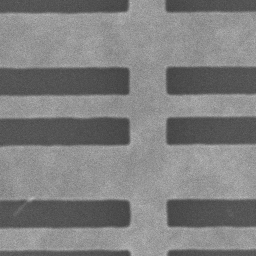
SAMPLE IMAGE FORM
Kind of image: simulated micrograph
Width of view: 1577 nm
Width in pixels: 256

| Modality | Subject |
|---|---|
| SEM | groups of lines, slits or small figures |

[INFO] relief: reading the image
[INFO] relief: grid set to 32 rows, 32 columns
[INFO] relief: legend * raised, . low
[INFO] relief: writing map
................*****...........
................*****...........
********************************
********************************
********************************
********************************
********************************
********************************
................*****...........
................*****...........
................*****...........
................*****...........
********************************
********************************
**************************......
................*****...........
................*****...........
................*****...........
********************************
********************************
********************************
********************************
********************************
********************************
********************************
................*****...........
................*****...........
................*****...........
...............********...****..
********************************
********************************
................*****...........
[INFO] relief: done